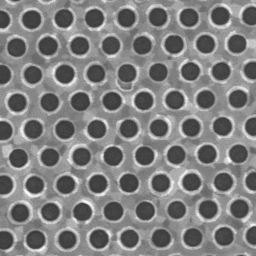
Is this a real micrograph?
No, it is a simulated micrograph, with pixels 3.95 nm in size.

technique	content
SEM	a regular array of holes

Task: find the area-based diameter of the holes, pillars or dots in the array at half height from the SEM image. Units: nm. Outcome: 77.4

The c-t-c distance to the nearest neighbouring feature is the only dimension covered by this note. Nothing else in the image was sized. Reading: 0.123 microns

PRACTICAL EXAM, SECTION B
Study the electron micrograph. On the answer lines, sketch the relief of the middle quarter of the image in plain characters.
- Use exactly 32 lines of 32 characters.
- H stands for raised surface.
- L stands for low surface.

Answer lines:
LLHHHHLLLHHHHHLLLHHHHHLLLHHHHHLL
LLLHHHLLLLHHHHLLLLHHHLLLLLHHHLLL
LLLHHLLLLLLHHLLLLLHHHLLLLLHHHLLL
LLLHHHLLLLHHHLLLLLHHHHLLLLHHHHLL
LLHHHHHLLHHHHLLLLHHHHHHLHHHHHHHH
HHHHHHHHHHHHHHLLLHHHHHHHHHHHHHHH
HHHHHHHHHHHHHHHLHHHHHHHHHHHHHHHH
HHHLLLHHHHLLLLHHHHLLLLHHHHLLLLHH
HHLLLLHHHHLLLLHHHHLLLLHHHLLLLLHH
HHLLLLHHHLLLLLLHHLLLLLLHHLLLLLHH
HHLLLLHHHHLLLLHHHHLLLLHHHHLLLLHH
HHHLLHHHHHHLLHHHHHHLLHHHHHHHHHHH
HHHHHHHHHHHHHHHHHHHHHHHHHHHHHHHH
HHHHHHHHHHHHHHHHHHHHHHHHHHHHHHHL
LLHHHHHLLLHHHHLLLLHHHHLLLLHHHHLL
LLLHHHLLLLLHHHLLLLLHHLLLLLHHHLLL
LLLHHHLLLLLHHHLLLLLHHLLLLLHHHLLL
LLLHHHLLLLHHHHLLLLHHHHLLLLHHHHLL
LLHHHHHLLHHHHHHLLHHHHHHHHHHHHHHH
HHHHHHHHHHHHHHHHHHHHHHHHHHHHHHHH
HHHHHHHHHHHHHHHHHHHHHHHHHHHLLHHH
HHHLLLHHHHLLLLHHHHLLLLHHHHLLLLHH
HHLLLLLHHHLLLLLHHHLLLLLHHHLLLLLH
HHLLLLLHHHLLLLLHHHLLLLLHHHLLLLHH
HHLLLLLHHHLLLLHHHHLLLLHHHHLLLLHH
HHHLLHHHHHHHLHHHHHHHHHHHHHHHHHHH
HHHHHHHHHHHHHHHHHHHHHHHHHHHHHHHH
HHHHHHHHLHHHHHHLLHHHHHHLLHHHHHLL
LLHHHHHLLLHHHHLLLLHHHHLLLLHHHHLL
LLLHHHLLLLLHHHLLLLLHHHLLLLLHHLLL
LLLHHHLLLLLHHHLLLLLHHHLLLLLHHLLL
LLLHHHHLLLHHHHLLLLHHHHLLLLHHHHLL